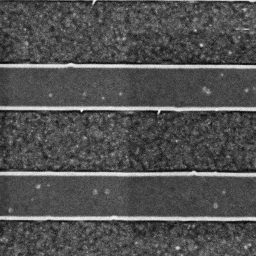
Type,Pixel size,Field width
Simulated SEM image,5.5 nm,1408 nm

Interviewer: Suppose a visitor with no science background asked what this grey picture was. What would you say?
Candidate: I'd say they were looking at one or a few lines or trenches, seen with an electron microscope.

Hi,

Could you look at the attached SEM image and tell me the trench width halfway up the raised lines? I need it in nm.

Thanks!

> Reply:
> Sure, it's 358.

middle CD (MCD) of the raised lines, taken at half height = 44.8 px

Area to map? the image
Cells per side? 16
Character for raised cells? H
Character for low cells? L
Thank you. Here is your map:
LLLLLLLLLLLLLLLL
LLLLLLLLLLLLLLLL
LLLLLLLLLLLLLLLL
LLLLLLLLLLLLLLLL
HHHHHHHHHHHHHHHH
HHHHHHHHHHHHHHHH
HHHHHHHHHHHHHHHH
LLLLLLLLLLLLLLLL
LLLLLLLLLLLLLLLL
LLLLLLLLLLLLLLLL
LLLLLLLLLLLLLLLL
HHHHHHHHHHHHHHHH
HHHHHHHHHHHHHHHH
HHHHHHHHHHHHHHHH
LLLLLLLLLLLLLLLL
LLLLLLLLLLLLLLLL